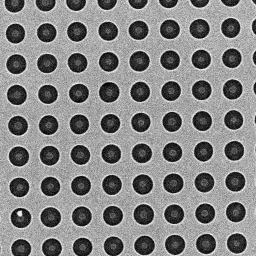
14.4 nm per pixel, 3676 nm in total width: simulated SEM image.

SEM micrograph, an array of small figures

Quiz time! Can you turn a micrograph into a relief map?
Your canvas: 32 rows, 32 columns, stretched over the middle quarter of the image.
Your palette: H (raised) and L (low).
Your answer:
HLLLLLHHHLLLLLHHLLLLLHHHHLLLLHHH
HHLLLHHHHHLLLHHHHLLLHHHHHHLHHHHH
HHHHHHHHHHHHHHHHHHHHHHHHHHHHHHHH
HHHHHHHHHHHHHHHHHHHHHHHHHHHHHHHH
HHHHHHHHHHHLHHHHHHLLHHHHHHLLHHHH
HHLLLHHHHLLLLHHHHLLLLHHHHLLLLHHH
HLLLLLHHHLLLLLHHHLLLLLHHLLLLLHHH
HLLLLLHHHLLLLLHHHLLLLHHHLLLLLHHH
HLLLLLHHHLLLLLHHHLLLLHHHHLLLLHHH
HHLLLHHHHHLLHHHHHHLHHHHHHHHHHHHH
HHHHHHHHHHHHHHHHHHHHHHHHHHHHHHHH
HHHHHHHHHHHHHHHHHHHHHHHHHHHHHHHH
HHHHHHHHHHHLHHHHHHLLLHHHHLLLLHHH
HHLLLLHHHLLLLLHHHLLLLLHHHLLLLHHH
HLLLLLHHHLLLLLHHHLLLLLHHLLLLLLHH
HLLLLLHHHLLLLLHHHLLLLHHHHLLLLHHH
HHLLLLHHHHLLLLHHHHLLLHHHHHLLLHHH
HHHLLHHHHHHHHHHHHHHHHHHHHHHHHHHH
HHHHHHHHHHHHHHHHHHHHHHHHHHHHHHHH
HHHHHHHHHHHHHHHHHHHHHHHHHHHHHHHH
HHHLLHHHHHLLLHHHHHLLLHHHHLLLLHHH
HHLLLLHHHLLLLLHHHLLLLLHHHLLLLLHH
HHLLLLLHHLLLLLHHHLLLLLHHHLLLLLHH
HHLLLLLHHHLLLLHHHLLLLLHHHLLLLHHH
HHLLLLHHHHLLLHHHHHLLLHHHHHLLHHHH
HHHHHHHHHHHHHHHHHHHHHHHHHHHHHHHH
HHHHHHHHHHHHHHHHHHHHHHHHHHHHHHHH
HHHHHHHHHHHHHHHHHHHLHHHHHHLLHHHH
HHHLLLHHHHLLLLHHHHLLLLHHHLLLLLHH
HHLLLLLHHHLLLLHHHLLLLLHHHLLLLLHH
HHLLLLLHHLLLLLLHHLLLLLHHHLLLLLHH
HHLLLLHHHHLLLLHHHHLLLLHHHLLLLHHH